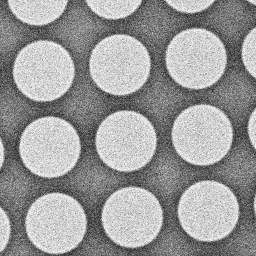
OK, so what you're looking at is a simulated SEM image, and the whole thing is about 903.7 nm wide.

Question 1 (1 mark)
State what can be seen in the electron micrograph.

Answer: an array of small figures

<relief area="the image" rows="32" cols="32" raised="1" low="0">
01111111000111111000011111000000
00111111000011111000000110000000
00011110000000000000000000000000
00000000000000000000000000000000
00000000000000110000001111100001
00001110000011111100011111110011
00011111000011111100011111110011
00111111100111111110011111110011
00111111100111111110011111110001
00111111100011111100011111110000
00111111100011111100000111000000
00011111000001111000000000000000
00000100000000000000000000000000
00000000000000000000000011100000
00000000000000111100001111110001
00001111100001111110001111111001
00011111100011111110001111111001
00011111110011111110001111111001
00011111110011111110001111111000
00011111110001111110000111110000
00011111100001111100000011000000
00001111000000000000000000000000
00000000000000000000000000000000
00000000000000001000000011110000
00000011000000111110000111111000
00001111110001111111001111111100
00001111110001111111001111111100
10011111111001111111001111111100
10011111111001111111000111111000
10001111110000111110000011110000
10001111110000011100000000000000
00000011000000000000000000000000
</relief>